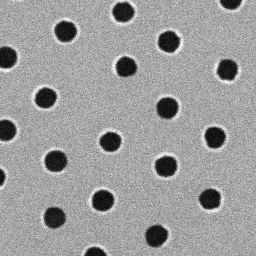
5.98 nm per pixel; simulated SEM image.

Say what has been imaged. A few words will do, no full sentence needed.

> a regular array of holes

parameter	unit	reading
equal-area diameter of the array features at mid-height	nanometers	135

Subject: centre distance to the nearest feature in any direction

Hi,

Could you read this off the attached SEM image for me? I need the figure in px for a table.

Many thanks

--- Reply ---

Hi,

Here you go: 56